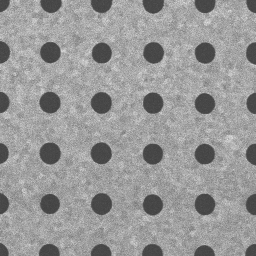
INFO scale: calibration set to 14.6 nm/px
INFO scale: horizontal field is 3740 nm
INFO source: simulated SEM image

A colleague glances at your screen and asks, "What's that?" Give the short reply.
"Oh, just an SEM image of a regular array of holes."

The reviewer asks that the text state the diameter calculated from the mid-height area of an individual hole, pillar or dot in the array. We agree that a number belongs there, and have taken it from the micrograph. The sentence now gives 304 nm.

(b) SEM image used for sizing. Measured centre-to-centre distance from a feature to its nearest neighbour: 736 nm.